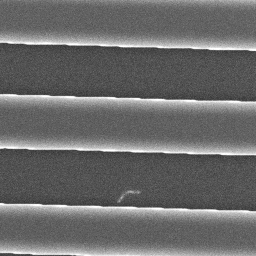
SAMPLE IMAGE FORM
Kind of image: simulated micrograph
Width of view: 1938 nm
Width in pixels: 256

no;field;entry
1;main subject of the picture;lines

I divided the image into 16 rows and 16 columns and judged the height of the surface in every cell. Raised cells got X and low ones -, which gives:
XXXXXXXXXXXXXXXX
XXXXXXXXXXXXXXXX
XXXXXXXXXXXXXXXX
----------------
----------------
----------------
XXXXXXXXXXXXXXXX
XXXXXXXXXXXXXXXX
XXXXXXXXXXXXXXXX
----------XXXXXX
----------------
----------------
----------------
XXXXXXXXXXXXXXXX
XXXXXXXXXXXXXXXX
XXXXXXXXXXXXXXXX